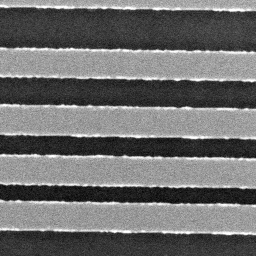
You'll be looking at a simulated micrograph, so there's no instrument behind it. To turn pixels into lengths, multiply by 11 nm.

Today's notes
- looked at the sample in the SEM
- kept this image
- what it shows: lines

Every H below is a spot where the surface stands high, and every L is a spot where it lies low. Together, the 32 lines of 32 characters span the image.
HHHHHHHHHHHHHHHHHHHHHHHHHHHHHHHH
LLLLLLLLLLLLLLLLLLLLLLLLLLLLLLLL
LLLLLLLLLLLLLLLLLLLLLLLLLLLLLLLL
LLLLLLLLLLLLLLLLLLLLLLLLLLLLLLLL
LLLLLLLLLLLLLLLLLLLLLLLLLLLLLLLL
LLLLLLLLLLLLLLLLLLLLLLLLLLLLLLLL
HHHHHHHHHHHHHHHHHHHHHHHHHHLHLLLL
HHHHHHHHHHHHHHHHHHHHHHHHHHHHHHHH
HHHHHHHHHHHHHHHHHHHHHHHHHHHHHHHH
HHHHHHHHHHHHHHHHHHHHHHHHHHHHHHHH
LLLLLLLLLLLLLLLLLLLLLLLLLLLLLLLL
LLLLLLLLLLLLLLLLLLLLLLLLLLLLLLLL
LLLLLLLLLLLLLLLLLLLLLLLLLLLLLLLL
HHHHHHHHHHHHHHHHHHHHHHHHLLLLLLLL
HHHHHHHHHHHHHHHHHHHHHHHHHHHHHHHH
HHHHHHHHHHHHHHHHHHHHHHHHHHHHHHHH
HHHHHHHHHHHHHHHHHHHHHHHHHHHHHHHH
LLLLLLLLLLLLLLLLLLLLLLLLLLLLLLLL
LLLLLLLLLLLLLLLLLLLLLLLLLLLLLLLL
HHHHHLLLLLLLLLLLLLLLLLLLLLLLLLLL
HHHHHHHHHHHHHHHHHHHHHHHHHHHHHHHH
HHHHHHHHHHHHHHHHHHHHHHHHHHHHHHHH
HHHHHHHHHHHHHHHHHHHHHHHHHHHHHHHH
LLLLLLLLLLLLLLLLLLLLLLLLLLLLLLLL
LLLLLLLLLLLLLLLLLLLLLLLLLLLLLLLL
HHHHHHHHHHHHHHHHHHHHHHLHLLLLLLLL
HHHHHHHHHHHHHHHHHHHHHHHHHHHHHHHH
HHHHHHHHHHHHHHHHHHHHHHHHHHHHHHHH
HHHHHHHHHHHHHHHHHHHHHHHHHHHHHHHH
LLLLLLLLLLLLLLLLLLLLLLLLLLLLLLLL
LLLLLLLLLLLLLLLLLLLLLLLLLLLLLLLL
LLLLLLLLLLLLLLLLLLLLLLLLLLLLLLLL